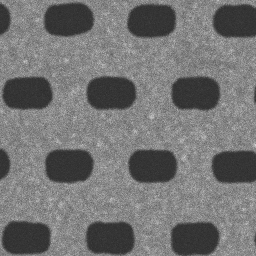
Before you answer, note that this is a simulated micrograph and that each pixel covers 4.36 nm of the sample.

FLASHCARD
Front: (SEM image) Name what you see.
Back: a regular array of holes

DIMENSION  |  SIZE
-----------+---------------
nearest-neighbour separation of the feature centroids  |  364 nanometers